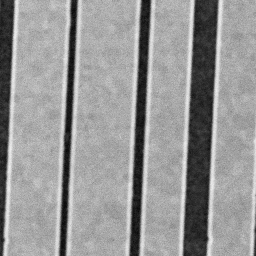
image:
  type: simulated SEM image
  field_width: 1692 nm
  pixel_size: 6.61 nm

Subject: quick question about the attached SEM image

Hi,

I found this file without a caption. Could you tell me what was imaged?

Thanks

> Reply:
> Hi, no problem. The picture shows one or a few lines or trenches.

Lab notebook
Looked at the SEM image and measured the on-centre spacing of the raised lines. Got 432 nm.